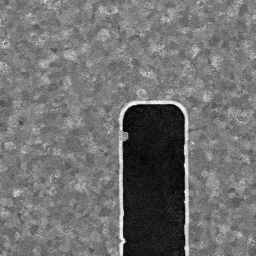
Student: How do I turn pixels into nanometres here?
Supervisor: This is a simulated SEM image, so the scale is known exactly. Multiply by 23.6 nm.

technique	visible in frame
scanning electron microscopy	one or a few lines or trenches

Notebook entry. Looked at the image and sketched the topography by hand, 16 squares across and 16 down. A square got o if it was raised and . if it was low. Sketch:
oooooooooooooooo
oooooooooooooooo
oooooooooooooooo
oooooooooooooooo
oooooooooooooooo
oooooooooooooooo
oooooooo...ooooo
oooooooo....oooo
oooooooo....oooo
oooooooo....oooo
oooooooo....oooo
oooooooo....oooo
oooooooo....oooo
oooooooo....oooo
oooooooo....oooo
oooooooo....oooo